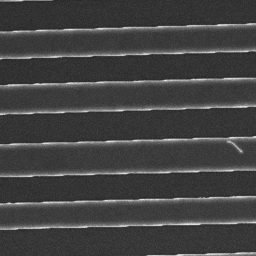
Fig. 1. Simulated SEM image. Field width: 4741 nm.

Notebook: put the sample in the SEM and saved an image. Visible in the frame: lines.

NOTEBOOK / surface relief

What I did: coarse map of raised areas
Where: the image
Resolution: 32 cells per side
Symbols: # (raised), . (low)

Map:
................................
................................
................................
...............#################
################################
################################
###########################.....
................................
................................
................................
........########################
################################
################################
########################........
................................
................................
................................
....................############
################################
################################
################################
######################..........
................................
................................
................................
.###############################
################################
################################
######..........................
................................
................................
................................